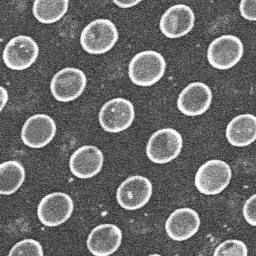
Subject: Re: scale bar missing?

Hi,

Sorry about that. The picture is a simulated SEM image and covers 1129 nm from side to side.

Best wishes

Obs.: a regular array of raised bodies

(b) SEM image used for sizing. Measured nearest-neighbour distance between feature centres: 247 nm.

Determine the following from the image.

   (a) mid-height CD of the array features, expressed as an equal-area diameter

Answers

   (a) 140 nm